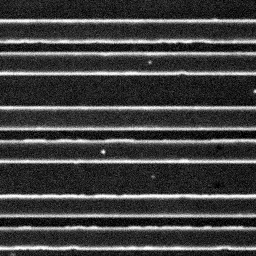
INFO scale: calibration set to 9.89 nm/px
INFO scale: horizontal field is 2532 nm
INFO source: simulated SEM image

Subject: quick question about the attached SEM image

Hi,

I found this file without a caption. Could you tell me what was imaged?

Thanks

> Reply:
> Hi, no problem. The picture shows lines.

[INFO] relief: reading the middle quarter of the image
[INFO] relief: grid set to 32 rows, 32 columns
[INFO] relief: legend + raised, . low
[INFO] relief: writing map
++++++++++++++++++++++++++++++++
++++++++++++++++++++++++++++++++
................................
................................
................................
................................
................................
................................
................................
................................
................................
++++++++++++++++++++++++++++++++
++++++++++++++++++++++++++++++++
++++++++++++++++++++++++++++++++
++++++++++++++++++++++++++++++++
++++++++++++++++++++++++++++++++
................................
................................
................................
++++++++++++++++++++++++++++++++
++++++++++++++++++++++++++++++++
++++++++++++++++++++++++++++++++
++++++++++++++++++++++++++++++++
++++++++++++++++++++++++++++++++
..+.............................
................................
................................
................................
................................
................................
................................
................................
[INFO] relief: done